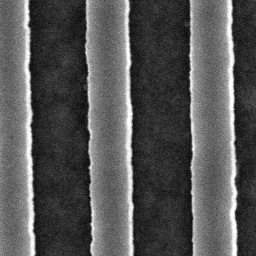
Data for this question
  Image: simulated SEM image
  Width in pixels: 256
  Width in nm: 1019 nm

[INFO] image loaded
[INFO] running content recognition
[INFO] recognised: lines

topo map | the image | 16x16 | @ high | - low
@@---@@@----@@--
@@---@@@----@@--
@@---@@@----@@@-
@@---@@@----@@@-
@@----@@----@@@-
@@----@@----@@@-
@@----@@----@@@-
@@----@@----@@@-
@@----@@----@@@-
@@----@@----@@@-
@@----@@----@@@-
@@----@@----@@@-
@@----@@----@@@-
@@----@@----@@@-
@@----@@----@@@-
@@----@@----@@@-